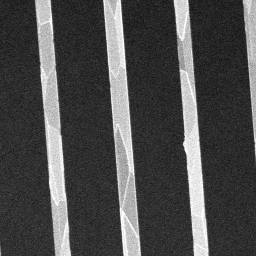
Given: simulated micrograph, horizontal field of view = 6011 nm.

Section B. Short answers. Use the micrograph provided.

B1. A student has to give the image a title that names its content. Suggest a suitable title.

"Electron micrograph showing one or a few lines or trenches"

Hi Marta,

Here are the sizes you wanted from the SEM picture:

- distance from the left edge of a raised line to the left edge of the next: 1620 nanometers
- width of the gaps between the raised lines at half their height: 1270 nm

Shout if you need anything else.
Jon